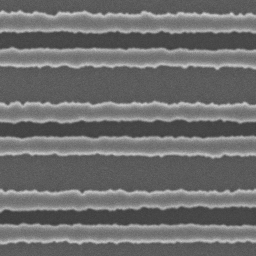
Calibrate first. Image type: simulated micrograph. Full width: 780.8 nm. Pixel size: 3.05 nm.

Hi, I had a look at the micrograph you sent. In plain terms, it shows lines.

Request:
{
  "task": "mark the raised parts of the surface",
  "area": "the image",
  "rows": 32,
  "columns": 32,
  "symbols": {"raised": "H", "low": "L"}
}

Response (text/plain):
LLLLLLLLLLLLLLLLLLLLLLLLLLLLLLLL
HLHLLLLLLLHLLLLLLLLLLLLLLLLLLLLL
HHHHHHHHHHHHHHHHHHHHHHHHHHHHHHHH
HHHHHHHHHHHHHHHHHHHHHHHHHHHHHHHH
LLLLLLLLLLLLLLLLLLLLLLLLLLLLLLLL
LLLLLLLLLLLLLLLLLLLLLLLLLLLLLLLL
HHHHHHHHHHHHHHHHHHHHHHHHHHHHHHHH
HHHHHHHHHHHHHHHHHHHHHHHHHHHHHHHH
LLLLLLLLLLLLLLLLLLLLLLLLLLLLLLLL
LLLLLLLLLLLLLLLLLLLLLLLLLLLLLLLL
LLLLLLLLLLLLLLLLLLLLLLLLLLLLLLLL
LLLLLLLLLLLLLLLLLLLLLLLLLLLLLLLL
LLLLLLLLLLLLLLLLLLLLLLLLLLLLLLLL
HHHHHHHHHHHHHHHHHHHHHHHHHHHHHHHH
HHHHHHHHHHHHHHHHHHHHHHHHHHHHHHHH
LLLLLLLLLLLLLLLLLLLLLLLLLLLLLLLL
LLLLLLLLLLLLLLLLLLLLLLLLLLLLLLLL
HHHHHHHHHHHHHHHHHHHHHHHHHHHHHHHH
HHHHHHHHHHHHHHHHHHHHHHHHHHHHHHHH
LLLLLLLLLLLLLLLLLLHLLLLLLLHHLLHL
LLLLLLLLLLLLLLLLLLLLLLLLLLLLLLLL
LLLLLLLLLLLLLLLLLLLLLLLLLLLLLLLL
LLLLLLLLLLLLLLLLLLLLLLLLLLLLLLLL
LLLLLLLLLLLLLLLLLLLLLLLLLLLLLLLL
HHHHHHHHHHHHHHHHHHHHHHHHHHHHHHHH
HHHHHHHHHHHHHHHHHHHHHHHHHHHHHHHH
LLLLLLLLLLLLLLLLLLLLLLLLLLLLLLLL
LLLLLLLLLLLLLLLLLLLLLLLLLLLLLLLL
HHHHHHHHHHHHHHHHHHHHHHHHHHHHHHHH
HHHHHHHHHHHHHHHHHHHHHHHHHHHHHHHH
LLLLLLLLLLLLLLLLLLLLLLLLLLLLLLLL
LLLLLLLLLLLLLLLLLLLLLLLLLLLLLLLL